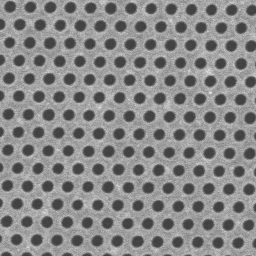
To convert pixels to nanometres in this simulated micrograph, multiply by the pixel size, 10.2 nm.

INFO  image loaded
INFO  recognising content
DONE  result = a regular array of holes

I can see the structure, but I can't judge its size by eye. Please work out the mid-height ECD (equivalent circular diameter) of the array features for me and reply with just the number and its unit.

120 nanometers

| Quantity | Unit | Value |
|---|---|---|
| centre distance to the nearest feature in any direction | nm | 204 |